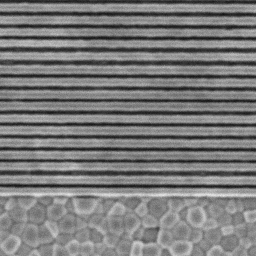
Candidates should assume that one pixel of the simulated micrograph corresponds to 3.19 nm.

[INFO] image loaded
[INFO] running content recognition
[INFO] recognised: parallel lines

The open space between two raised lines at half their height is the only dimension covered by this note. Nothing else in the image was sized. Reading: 4.39 pixels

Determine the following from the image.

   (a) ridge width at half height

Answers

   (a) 25.1 nanometres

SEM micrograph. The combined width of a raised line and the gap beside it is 12.3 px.